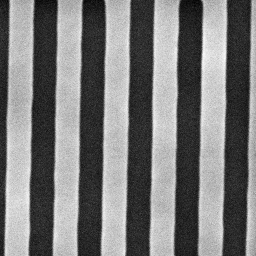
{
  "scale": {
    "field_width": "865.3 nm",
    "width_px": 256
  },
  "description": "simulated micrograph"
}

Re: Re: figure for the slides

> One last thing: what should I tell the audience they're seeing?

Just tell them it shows groups of lines, slits or small figures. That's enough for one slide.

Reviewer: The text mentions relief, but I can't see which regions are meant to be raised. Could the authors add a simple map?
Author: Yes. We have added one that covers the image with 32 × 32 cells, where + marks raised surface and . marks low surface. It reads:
.+++...+++...+++...+++...+++....
.+++...+++...+++...+++...+++....
.+++...+++...+++...+++...+++....
.+++...+++...+++...+++...+++....
.+++...+++...+++...+++...+++....
.+++...+++...+++...+++...+++....
.+++...+++...+++...+++...+++...+
.+++...+++...+++...+++...+++...+
.+++...+++...+++...+++...+++...+
.+++...+++...+++...+++...+++...+
.+++...+++...+++...+++...+++...+
.+++...+++...+++...+++...+++...+
.+++...+++...+++...+++...+++...+
.+++...+++...+++...+++...+++...+
.+++...+++...+++...+++...+++...+
.+++...+++...+++...+++...+++...+
.+++...+++...+++...+++...+++...+
.+++...+++...+++...+++...+++...+
.+++...+++...+++...+++...+++...+
.+++...+++...+++...+++...+++...+
.+++...+++...+++...+++...+++...+
.+++...+++...+++...+++...+++...+
.+++...+++...+++...+++...+++...+
.+++...+++...+++...+++...+++...+
.+++...+++...+++...+++...+++...+
.+++...+++...+++...+++...+++...+
.+++...+++...+++...+++...+++...+
.+++...+++...+++...+++...+++...+
.+++...+++...+++...+++...+++...+
.+++...+++...+++...+++...+++...+
.+++...+++...+++...+++...+++...+
.+++...+++...+++...+++...+++...+